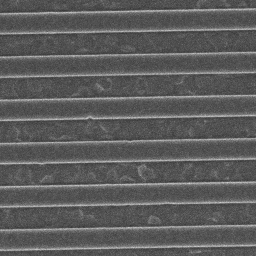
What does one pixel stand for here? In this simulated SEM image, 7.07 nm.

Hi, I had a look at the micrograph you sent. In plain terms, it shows parallel lines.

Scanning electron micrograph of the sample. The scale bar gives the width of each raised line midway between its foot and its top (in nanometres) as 148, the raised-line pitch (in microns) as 0.306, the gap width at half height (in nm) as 161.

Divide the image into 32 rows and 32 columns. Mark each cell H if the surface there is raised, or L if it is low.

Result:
LLLLLLLLLLLLLLLLLLLLLLLLLLLLLLLL
LLLLLLLLLLLHHHHHHHHHHHHHHHHHHHHH
HHHHHHHHHHHHHHHHHHHHHHHHHHHHHHHH
HHHHHHHHHHHHHHHHHHHHHHHHHHHHHHHH
LLLLLLLLLLLLLLLLLLLLLLLLLLLLLLLL
LLLLLLLLLLLLLLLLLLLLLLLLLLLLLLLL
LLLLLLLLLLLLLLLLLLLLLLLLLLLLLLLL
HHHHHHHHHHHHHHHHHHHHHHHHHHHHHHHH
HHHHHHHHHHHHHHHHHHHHHHHHHHHHHHHH
HHHHHHHHHLLLLLLLLLLLLLLLLLLLLLLL
LLLLLLLLLLLLLLLLLLLLLLLLLLLLLLLL
LLLLLLLLLLLLLLLLLLLLLLLLLLLLLLLL
LLLLLLHHHHHHHHHHHHHHHHHHHHHHHHHH
HHHHHHHHHHHHHHHHHHHHHHHHHHHHHHHH
HHHHHHHHHHHHHHHHHHHHHHHHHHLLLLLL
LLLLLLLLLLLLLLLLLLLLLLLLLLLLLLLL
LLLLLLLLLLLLLLLLLLLLLLLLLLLLLLLL
LLLLLLLLLLLLLLLLLLLLLLLLHHHHHHHH
HHHHHHHHHHHHHHHHHHHHHHHHHHHHHHHH
HHHHHHHHHHHHHHHHHHHHHHHHHHHHHHHH
LLLLLLLLLLLLLLLLLLLLLLLLLLLLLLLL
LLLLLLLLLLLLLLLLLLLLLLLLLLLLLLLL
LLLLLLLLLLLLLLLLLLLLLLLLLLLLLLLL
HHHHHHHHHHHHHHHHHHHHHHHHHHHHHHHH
HHHHHHHHHHHHHHHHHHHHHHHHHHHHHHHH
HHHHHHHHHHHHHHHHLLLLLLLLLLLLLLLL
LLLLLLLLLLLLLLLLLLLLLLLLLLLLLLLL
LLLLLLLLLLLLLLLLLLLLLLLLLLLLLLLL
LLLLLLLLLLLLHHLLLLHHHHHHHHHHHHHH
HHHHHHHHHHHHHHHHHHHHHHHHHHHHHHHH
HHHHHHHHHHHHHHHHHHHHHHHHHHHHHHHH
LLLLLLLLLLLLLLLLLLLLLLLLLLLLLLLL